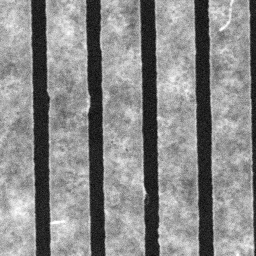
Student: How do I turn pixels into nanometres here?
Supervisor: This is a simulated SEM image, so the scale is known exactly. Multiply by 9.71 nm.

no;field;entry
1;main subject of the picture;parallel lines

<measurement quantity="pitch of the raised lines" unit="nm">527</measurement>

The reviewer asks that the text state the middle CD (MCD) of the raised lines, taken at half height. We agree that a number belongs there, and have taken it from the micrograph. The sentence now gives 381 nm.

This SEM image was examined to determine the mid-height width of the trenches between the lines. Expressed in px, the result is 15.6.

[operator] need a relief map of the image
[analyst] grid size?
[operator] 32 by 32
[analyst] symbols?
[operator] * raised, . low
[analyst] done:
****..*****..****..*****..*****.
****..*****..****..**.**..*****.
****..*****..****...****..*****.
****..*****..*****..****..*****.
****..*****..*****..****..*****.
****..*****..****...****..*****.
****..*****..****...****..*****.
****..*****..****...****..*****.
****..*****..*****..****..*****.
****..*****..*****..****..*****.
****..*****..*****..****..*****.
****..*****..*****..****..*****.
****..*****..*****..****..*****.
****..*****..*****..****..*****.
****..*****..*****..****...****.
****..*****..*****..****...****.
****..*****..*****..****...****.
****..*****..*****..*****..****.
****..*****..*****..****...****.
****..*****..*****..*****..****.
****..*****..*****..*****..****.
****..*****..*****..*****..****.
****..*****..*****..*****..****.
****..*****..*****..*****..****.
****..*****..*****..*****..*****
****..*****..*****..*****..*****
****..*****..*****..*****..*****
****..*****..*****..*****..*****
****..*****..*****..*****..*****
****..*****..*****..*****..*****
****..*****..*****..*****..*****
****..*****..*****..*****..*****